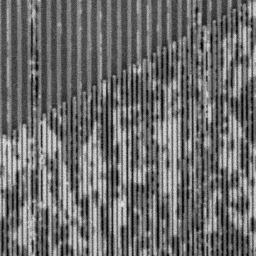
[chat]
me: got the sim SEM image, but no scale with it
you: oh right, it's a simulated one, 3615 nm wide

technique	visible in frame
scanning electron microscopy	parallel lines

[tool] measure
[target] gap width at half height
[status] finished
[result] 22.9 nm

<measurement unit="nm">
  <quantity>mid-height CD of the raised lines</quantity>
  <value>47.7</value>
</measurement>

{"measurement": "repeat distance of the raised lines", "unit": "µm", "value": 0.0706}